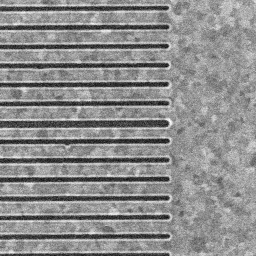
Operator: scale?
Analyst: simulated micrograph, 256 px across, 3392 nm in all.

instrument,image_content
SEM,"parallel lines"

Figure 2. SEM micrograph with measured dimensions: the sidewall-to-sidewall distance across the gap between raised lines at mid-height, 86.1 nm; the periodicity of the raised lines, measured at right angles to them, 252 nm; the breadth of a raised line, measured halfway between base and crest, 161 nm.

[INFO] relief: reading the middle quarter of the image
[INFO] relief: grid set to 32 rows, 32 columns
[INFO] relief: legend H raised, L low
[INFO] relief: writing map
LLLLLLLLLLLLLLLLLLLLLLLLLLHHHHHH
HHHHHHHHHHHHHHHHHHHHHHHHHHHHHHHH
HHHHHHHHHHHHHHHHHHHHHHHHHHHHHHHH
HHHHHHHHHHHHHHHHHHHHHHHHHHHHHHHH
LLLLLLLLLLLLLLLLLLLLLLLLLLHHHHHH
LLLLLLLLLLLLLLLLLLLLLLLLLLHHHHHH
HHHHHHHHHHHHHHHHHHHHHHHHHHHHHHHH
HHHHHHHHHHHHHHHHHHHHHHHHHHHHHHHH
HHHHHHHHHHHHHHHHHHHHHHHHHHHHHHHH
LLLLLLLLLLLLLLLLLLLLLLLLLLHHHHHH
LLLLLLLLLLLLLLLLLLLLLLLLLLHHHHHH
HHHHHHHHHHHHHHHHHHHHHHHHHHHHHHHH
HHHHHHHHHHHHHHHHHHHHHHHHHHHHHHHH
HHHHHHHHHHHHHHHHHHHHHHHHHHHHHHHH
LLLLLLLLLLLLLLLLLLLLLLLLLLLHHHHH
LLLLLLLLLLLLLLLLLLLLLLLLLLLHHHHH
HHHHHHHHHHHHHHHHHHHHHHHHHHHHHHHH
HHHHHHHHHHHHHHHHHHHHHHHHHHHHHHHH
LLLLLLLLLLLLLLLLLLLLLLLLLLHHHHHH
LLLLLLLLLLLLLLLLLLLLLLLLLLLHHHHH
LLHHHHHHHHHHHHHHHHHHHHHHHHHHHHHH
HHHHHHHHHHHHHHHHHHHHHHHHHHHHHHHH
HHHHHHHHHHHHHHHHHHHHHHHHHHHHHHHH
LLLLLLLLLLLLLLLLLLLLLLLLLLHHHHHH
LLLLLLLLLLLLLLLLLLLLLLLLLLHHHHHH
HHHHHHHHHHHHHHHHHHHHHHHHHHHHHHHH
HHHHHHHHHHHHHHHHHHHHHHHHHHHHHHHH
HHHHHHHHHHHHHHHHHHHHHHHHHHHHHHHH
LLLLLLLLLLLLLLLLLLLLLLLLLLHHHHHH
LLLLLLLLLLLLLLLLLLLLLLLLLLHHHHHH
HHHHHHHHHHHHHHHHHHHHHHHHHHHHHHHH
HHHHHHHHHHHHHHHHHHHHHHHHHHHHHHHH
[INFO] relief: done